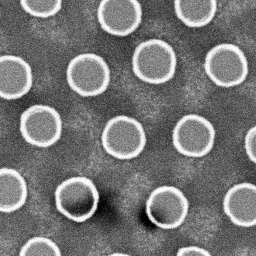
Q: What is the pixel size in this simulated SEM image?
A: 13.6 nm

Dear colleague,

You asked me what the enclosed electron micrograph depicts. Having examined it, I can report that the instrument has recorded a regular array of raised bodies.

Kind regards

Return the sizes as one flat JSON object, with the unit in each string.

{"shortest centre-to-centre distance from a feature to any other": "958 nm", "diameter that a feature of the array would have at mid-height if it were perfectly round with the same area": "535 nanometers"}